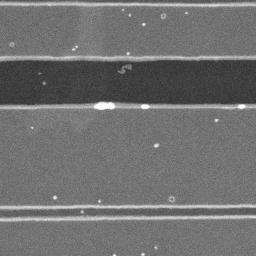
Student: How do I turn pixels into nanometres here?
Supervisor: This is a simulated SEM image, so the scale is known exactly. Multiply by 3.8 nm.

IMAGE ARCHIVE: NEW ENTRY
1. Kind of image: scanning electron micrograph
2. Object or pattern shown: lines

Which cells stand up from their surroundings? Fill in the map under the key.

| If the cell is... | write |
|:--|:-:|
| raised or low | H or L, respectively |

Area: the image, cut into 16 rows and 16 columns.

HHHHHHHHHHHHHHHH
HHHHHHHHHHHHHHHH
HHHHHHHHHHHHHHHH
HHHHHHHHHHHHHHHH
LLLLLLLLLLLLLLLL
LLLLLLLLLLLLLLLL
LLLLLLHLLLLLLLLL
HHHHHHHHHHHHHHHH
HHHHHHHHHHHHHHHH
HHHHHHHHHHHHHHHH
HHHHHHHHHHHHHHHH
HHHHHHHHHHHHHHHH
HHHHHHHHHHHHHHHH
HHHHHHHHHHHHHHHH
HHHHHHHHHHHHHHHH
HHHHHHHHHHHHHHHH